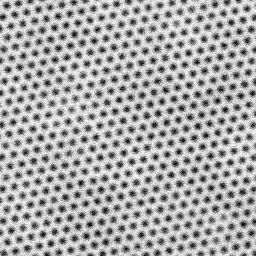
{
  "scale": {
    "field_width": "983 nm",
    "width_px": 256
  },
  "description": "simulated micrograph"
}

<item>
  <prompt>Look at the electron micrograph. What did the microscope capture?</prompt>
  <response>a regular array of holes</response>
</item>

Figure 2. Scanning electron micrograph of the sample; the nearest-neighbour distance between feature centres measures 45.4 nm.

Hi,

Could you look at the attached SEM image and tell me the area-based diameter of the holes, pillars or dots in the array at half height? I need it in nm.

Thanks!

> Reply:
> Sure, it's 31.5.